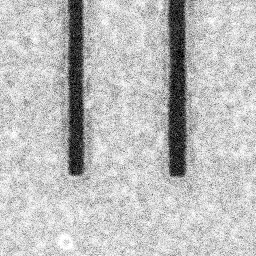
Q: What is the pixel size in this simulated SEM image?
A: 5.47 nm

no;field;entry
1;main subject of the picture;one or a few lines or trenches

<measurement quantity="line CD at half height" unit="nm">106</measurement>